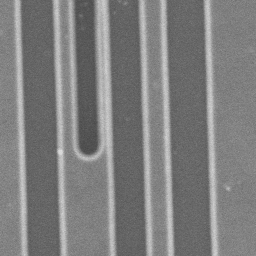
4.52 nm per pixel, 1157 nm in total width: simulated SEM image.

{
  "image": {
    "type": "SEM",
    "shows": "groups of lines, slits or small figures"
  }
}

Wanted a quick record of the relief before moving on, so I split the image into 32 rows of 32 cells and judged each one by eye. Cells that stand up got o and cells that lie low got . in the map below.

oo.....oo...o.....oo......oooooo
oo.....oo...o.....oo......oooooo
oo.....oo...o.....oo......oooooo
oo.....oo...o.....ooo.....oooooo
oo.....oo...o.....ooo.....oooooo
oo.....oo...o.....ooo.....oooooo
oo.....oo...o.....ooo.....oooooo
oo.....oo...o.....ooo.....oooooo
oo.....oo...oo....ooo.....oooooo
oo.....oo...oo....ooo.....oooooo
ooo....oo...oo....ooo.....oooooo
ooo....oo...oo....ooo.....oooooo
ooo....oo...oo....ooo.....oooooo
ooo....oo...oo....ooo.....oooooo
ooo....oo...oo....ooo.....oooooo
ooo....oo...oo....ooo.....oooooo
ooo....ooo..oo....ooo.....oooooo
ooo....ooo...o....ooo.....oooooo
ooo....ooo..oo....ooo.....oooooo
ooo....oooo.oo....ooo.....oooooo
ooo.....oooooo....ooo.....oooooo
ooo.....oooooo....ooo.....oooooo
ooo.....oooooo....ooo.....oooooo
ooo.....oooooo....ooo.....oooooo
ooo.....oooooo....ooo......ooooo
ooo.....oooooo....ooo......ooooo
ooo.....oooooo....ooo......ooooo
ooo.....oooooo....ooo......ooooo
ooo.....oooooo....ooo......ooooo
ooo.....oooooo.....oo......ooooo
ooo.....oooooo.....oo......ooooo
ooo.....oooooo.....oo......ooooo